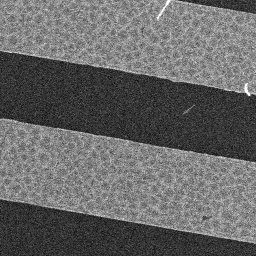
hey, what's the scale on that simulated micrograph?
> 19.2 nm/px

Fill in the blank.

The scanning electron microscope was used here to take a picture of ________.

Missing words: one or a few lines or trenches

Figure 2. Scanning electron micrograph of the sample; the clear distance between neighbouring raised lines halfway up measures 1300 nanometers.